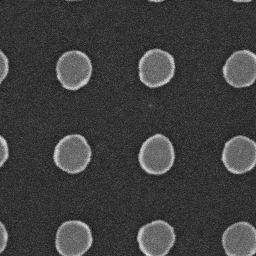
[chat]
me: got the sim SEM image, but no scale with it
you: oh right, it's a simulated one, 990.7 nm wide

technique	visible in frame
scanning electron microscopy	raised bodies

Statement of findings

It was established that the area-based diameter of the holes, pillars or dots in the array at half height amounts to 0.141 micrometres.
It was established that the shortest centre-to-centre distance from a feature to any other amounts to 323 nanometers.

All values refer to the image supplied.